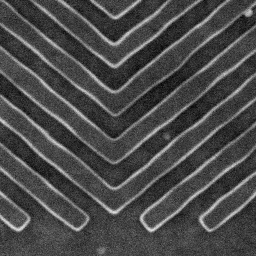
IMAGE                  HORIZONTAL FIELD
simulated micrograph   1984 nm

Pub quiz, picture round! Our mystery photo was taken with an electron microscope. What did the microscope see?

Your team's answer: groups of lines, slits or small figures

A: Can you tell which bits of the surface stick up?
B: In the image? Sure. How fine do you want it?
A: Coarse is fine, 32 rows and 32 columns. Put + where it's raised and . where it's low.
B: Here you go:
+...++++....+++++....+++....++++
++....++++...+++....+++....++++.
+++....++++.......++++....+++...
.+++....++++.....++++...++++....
..++++...++++...++++...++++...++
...++++...++++++++....+++....+++
+...++++....+++++...++++....++++
++....+++....+++...++++....+++..
+++....++++.......++++....+++...
.++++...++++.....++++...++++....
..++++...++++...++++...++++...++
...++++....+++++++....++++...+++
+...++++....+++++....++++...++++
++...++++....+++...++++....++++.
+++....+++........++++....+++...
.+++....++++.....++++....+++....
..++++...++++...+++....++++....+
...++++...++++++++....++++...+++
+...++++...++++++....++++...++++
++...++++....+++....+++....++++.
+++...+++++.......++++....++++..
.+++....++++.....++++...++++....
..++++...++++...++++...++++....+
...++++...++++++++....++++...+++
+...++++...++++++....+++....++++
++...++++....+++...++++....++++.
+++...++++....+...++++....++++..
++++....+++.......+++....+++....
..+......+........++......+.....
................................
................................
................................